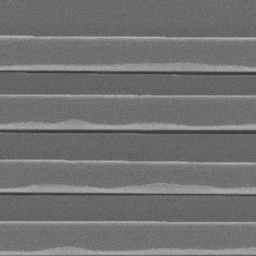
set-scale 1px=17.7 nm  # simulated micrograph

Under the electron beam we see lines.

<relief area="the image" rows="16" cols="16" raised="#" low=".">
................
................
################
################
................
................
################
################
................
................
################
################
................
................
################
################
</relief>